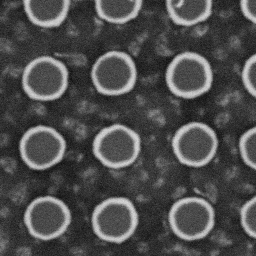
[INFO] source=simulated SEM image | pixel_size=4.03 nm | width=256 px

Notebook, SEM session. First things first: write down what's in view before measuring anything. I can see a regular array of raised bodies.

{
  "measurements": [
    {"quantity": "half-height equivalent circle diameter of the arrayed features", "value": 165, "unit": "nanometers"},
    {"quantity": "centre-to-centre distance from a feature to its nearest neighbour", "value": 0.279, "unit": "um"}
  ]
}